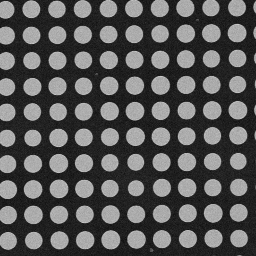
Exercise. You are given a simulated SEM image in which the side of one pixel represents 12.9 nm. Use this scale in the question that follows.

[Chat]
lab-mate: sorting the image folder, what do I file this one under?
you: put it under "an array of small figures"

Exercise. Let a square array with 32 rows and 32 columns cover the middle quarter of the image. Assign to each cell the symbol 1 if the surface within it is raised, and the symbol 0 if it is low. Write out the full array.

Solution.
00011100001110001110001111000111
00000000000000000000000000000000
00000000000000000000000000000000
00000000001100000110000111000111
00011110011110001111001111001111
00011110011111001111001111001111
00011110011110001111001111000111
00001100001100000110000000000000
00000000000000000000000000000000
00000000000000000000000110000000
00011110001110001111001111000111
10011110011111001111001111001111
10011110011111001111001111000111
00011100001110001110000110000011
00000000000000000000000000000000
00000000000000000000000000000000
00001100001110001110000111000111
10011110011111001111001111000111
10011110011111001111001111001111
10011110001110001111001111000111
00000000000000000000000000000000
00000000000000000000000000000000
00000000000000000000000000000011
10011110001110001111001111000111
10011110011110001111001111100111
10011110011111001111001111000111
00011100001100000110000111000011
00000000000000000000000000000000
00000000000000000000000000000000
00011110001110000110000111000111
10011110001111001111001111100111
10011110001111001111001111100111